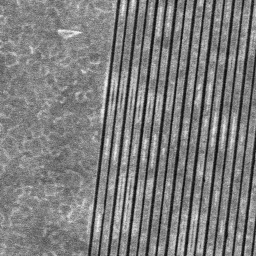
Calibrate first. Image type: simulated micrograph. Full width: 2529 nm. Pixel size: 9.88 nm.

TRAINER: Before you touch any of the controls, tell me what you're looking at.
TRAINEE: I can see parallel lines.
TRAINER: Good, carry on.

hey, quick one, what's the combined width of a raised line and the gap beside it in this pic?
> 0.0936 µm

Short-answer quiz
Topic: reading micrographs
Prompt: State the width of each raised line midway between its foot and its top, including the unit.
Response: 0.0625 micrometres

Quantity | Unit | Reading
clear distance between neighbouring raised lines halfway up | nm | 27